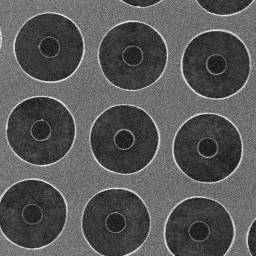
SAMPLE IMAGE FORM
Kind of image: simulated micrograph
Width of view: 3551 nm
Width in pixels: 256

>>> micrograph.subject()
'an array of small figures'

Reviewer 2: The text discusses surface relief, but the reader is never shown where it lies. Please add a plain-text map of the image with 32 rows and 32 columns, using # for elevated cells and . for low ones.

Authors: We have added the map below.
################...######......#
##########################....##
####.....#######################
###.......####.....#############
##........###.......#####.....##
##...##...###........###......##
##...##...##...###...##........#
##........##....##...##...##...#
###.......###........##...##...#
####.....####.......###........#
##############.....####........#
########################......##
###....#########################
##......######...###############
#........###.......#####....####
#...##...###.......####......###
#...##...##....#....##........##
#........##...###...##...##...##
#........##....#....##...##...##
##......####.......###...##...##
####..######.......###........##
##############...######......###
###..###################....####
#......#########################
........####.....###############
........###.......####......####
...##...##.........##.......####
...##...##...###...##........###
........##...###...##...##...##.
#......####.......###...##...##.
##....#####.......###........##.
############.....####.......###.